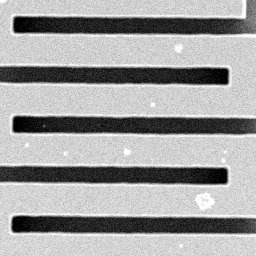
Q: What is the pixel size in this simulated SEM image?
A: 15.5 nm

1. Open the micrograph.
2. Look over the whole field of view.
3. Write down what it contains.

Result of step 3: groups of lines, slits or small figures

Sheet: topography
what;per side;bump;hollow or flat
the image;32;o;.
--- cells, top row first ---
ooooooooooooooooooooooooooooooo.
ooooooooooooooooooooooooooooooo.
oo..............................
oo..............................
oooooooooooooooooooooooooooooooo
oooooooooooooooooooooooooooooooo
oooooooooooooooooooooooooooooooo
oooooooooooooooooooooooooooooooo
............................oooo
.............................ooo
oo.oooooo...................oooo
oooooooooooooooooooooooooooooooo
oooooooooooooooooooooooooooooooo
oooooooooooooooooooooooooooooooo
oo...........ooo..oooooooooooooo
o...............................
oo..............................
oooooooooooooooooooooooooooooooo
oooooooooooooooooooooooooooooooo
oooooooooooooooooooooooooooooooo
oooooooooooooooooooooooooooooooo
.............................ooo
.............................ooo
oooooooooooooooooooooooooooooooo
oooooooooooooooooooooooooooooooo
oooooooooooooooooooooooooooooooo
oooooooooooooooooooooooooooooooo
o...............................
o...............................
oooooooooooooooooooooooooooooooo
oooooooooooooooooooooooooooooooo
oooooooooooooooooooooooooooooooo